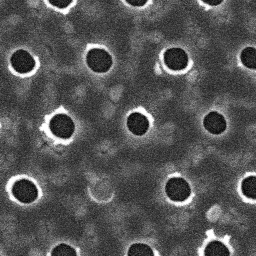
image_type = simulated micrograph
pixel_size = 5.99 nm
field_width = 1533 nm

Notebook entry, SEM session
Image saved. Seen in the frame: a regular array of holes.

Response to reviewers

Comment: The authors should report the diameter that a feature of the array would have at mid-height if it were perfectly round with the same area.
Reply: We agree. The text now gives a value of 148 nm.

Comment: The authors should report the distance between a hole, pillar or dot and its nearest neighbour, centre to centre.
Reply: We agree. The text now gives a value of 0.448 micrometres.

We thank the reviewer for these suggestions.